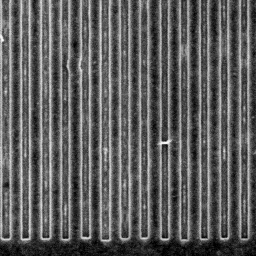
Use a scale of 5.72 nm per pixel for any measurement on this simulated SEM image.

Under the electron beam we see parallel lines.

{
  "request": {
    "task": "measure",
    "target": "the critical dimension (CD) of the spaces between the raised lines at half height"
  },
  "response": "0.0401 um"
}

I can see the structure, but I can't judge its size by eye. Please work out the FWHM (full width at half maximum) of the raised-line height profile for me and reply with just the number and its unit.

74.4 nm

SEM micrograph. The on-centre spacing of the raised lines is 114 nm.